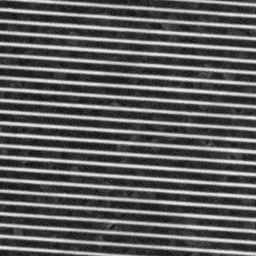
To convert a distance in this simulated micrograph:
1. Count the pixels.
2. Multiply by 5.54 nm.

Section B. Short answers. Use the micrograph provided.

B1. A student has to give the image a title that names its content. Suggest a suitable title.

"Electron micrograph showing parallel lines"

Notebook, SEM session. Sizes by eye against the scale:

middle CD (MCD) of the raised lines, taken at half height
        12.4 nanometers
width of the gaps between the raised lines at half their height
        51.8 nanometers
